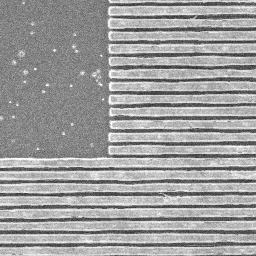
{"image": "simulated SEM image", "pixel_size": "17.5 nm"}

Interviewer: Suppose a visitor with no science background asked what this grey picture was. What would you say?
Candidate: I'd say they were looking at parallel lines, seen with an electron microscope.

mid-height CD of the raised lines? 134 nm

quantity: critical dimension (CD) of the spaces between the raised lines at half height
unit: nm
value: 83.2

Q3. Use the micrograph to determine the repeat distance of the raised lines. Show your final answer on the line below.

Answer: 221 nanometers